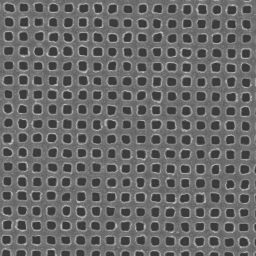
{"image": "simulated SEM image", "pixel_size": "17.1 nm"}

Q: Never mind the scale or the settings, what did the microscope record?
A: a regular array of holes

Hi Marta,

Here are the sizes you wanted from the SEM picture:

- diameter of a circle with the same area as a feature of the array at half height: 8.96 pixels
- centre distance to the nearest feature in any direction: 242 nm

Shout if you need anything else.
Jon